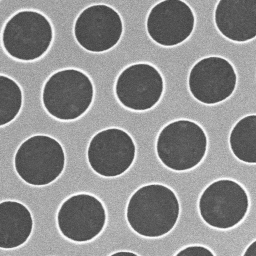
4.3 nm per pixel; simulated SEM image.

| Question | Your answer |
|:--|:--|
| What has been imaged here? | a regular array of holes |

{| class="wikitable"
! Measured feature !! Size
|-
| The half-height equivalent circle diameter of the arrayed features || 0.212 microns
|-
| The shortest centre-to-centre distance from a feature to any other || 0.305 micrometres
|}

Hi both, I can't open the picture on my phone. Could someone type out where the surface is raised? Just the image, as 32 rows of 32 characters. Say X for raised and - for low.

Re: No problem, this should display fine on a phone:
XXXXXXXXXXXXXXXXXXXX---XXXX-----
XX---XXXXX----XXXXX-----XXX-----
X-----XXXX-----XXX------XXX-----
------XXX------XXX------XXX-----
-------XX------XXXX-----XXXX----
------XXXX----XXXXXX--XXXXXXXXXX
X-----XXXXXXXXXXXXXXXXXXXXXXXXXX
XXX-XXXXXXXXXXXXXXXXXXXXX---XXXX
XXXXXXXXXXXXXXXX---XXXXX-----XXX
-XXXXX-----XXXX-----XXXX-----XXX
--XXXX-----XXX------XXXX------XX
---XX-------XX------XXXX-----XXX
---XX-------XXX-----XXXXX---XXXX
---XXX-----XXXXX---XXXXXXXXXXXXX
--XXXXX---XXXXXXXXXXXXXXXXXXXXX-
-XXXXXXXXXXXXXXXXXXXX----XXXXX--
XXXXXXXXXXXX----XXXX-----XXXX---
XXX----XXXX------XXX------XXX---
XX------XXX------XXX------XXX---
XX------XXX------XXX-----XXXX---
XX------XXX-----XXXX-----XXXXXXX
XX------XXXX---XXXXXXXXXXXXXXXXX
XXX----XXXXXXXXXXXXXXXXXXXXX-XXX
XXXXXXXXXXXXXXXXXX---XXXXX----XX
XXXXXXXXX---XXXXX-----XXX------X
---XXXXX-----XXX------XXX------X
----XXX------XXX------XXX------X
----XXX------XXX------XXX-----XX
----XXX------XXXX-----XXXXX--XXX
----XXXX----XXXXXX--XXXXXXXXXXXX
---XXXXXXXXXXXXXXXXXXXXXXXXXXXX-
XXXXXXXXXXXXXXX-XXXXXX----XXXXX-